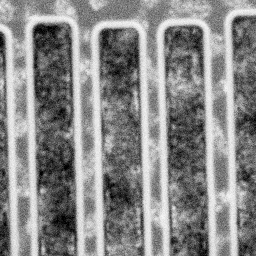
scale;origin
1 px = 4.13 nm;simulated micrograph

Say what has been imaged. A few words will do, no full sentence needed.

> one or a few lines or trenches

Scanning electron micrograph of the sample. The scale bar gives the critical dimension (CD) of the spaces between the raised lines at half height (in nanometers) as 185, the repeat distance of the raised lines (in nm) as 273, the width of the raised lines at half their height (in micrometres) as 0.0904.